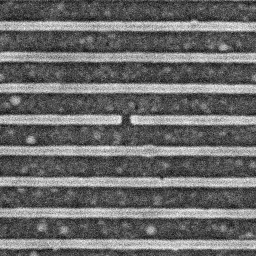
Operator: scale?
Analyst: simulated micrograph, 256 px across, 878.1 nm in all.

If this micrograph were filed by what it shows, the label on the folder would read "parallel lines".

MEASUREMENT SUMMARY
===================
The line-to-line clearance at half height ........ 79.4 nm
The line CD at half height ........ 27.5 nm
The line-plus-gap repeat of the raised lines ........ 0.107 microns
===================